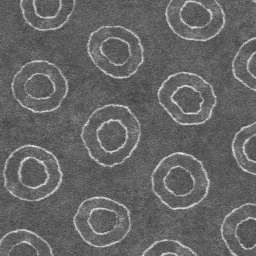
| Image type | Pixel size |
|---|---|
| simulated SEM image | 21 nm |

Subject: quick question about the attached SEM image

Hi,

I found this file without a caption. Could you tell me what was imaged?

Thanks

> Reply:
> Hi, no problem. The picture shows ring-shaped raised bodies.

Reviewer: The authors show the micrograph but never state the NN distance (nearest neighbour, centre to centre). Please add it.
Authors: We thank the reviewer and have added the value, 1750 nm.